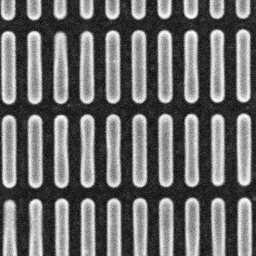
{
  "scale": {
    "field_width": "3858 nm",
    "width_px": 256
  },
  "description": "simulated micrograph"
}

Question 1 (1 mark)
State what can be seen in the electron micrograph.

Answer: groups of lines, slits or small figures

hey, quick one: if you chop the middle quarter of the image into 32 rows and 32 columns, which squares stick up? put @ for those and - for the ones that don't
@---@@@----@@@---@@@----@@@----@
@---@@@----@@@---@@@----@@@----@
@---@@@----@@@---@@@----@@@----@
@---@@@----@@@---@@@----@@@---@@
@---@@@----@@@---@@@----@@@---@@
@---@@@----@@@---@@@----@@@---@@
@---@@@----@@@---@@@----@@@---@@
@---@@@----@@@---@@@----@@@---@@
@---@@@----@@@---@@@----@@@---@@
-----@@----@@-----@@-----@-----@
--------------------------------
--------------------------------
--------------------------------
-----@@----@@@----@@----@@@----@
@---@@@----@@@---@@@----@@@----@
@---@@@----@@@---@@@----@@@----@
----@@@----@@@---@@@----@@@----@
----@@@----@@@---@@@----@@@----@
-----@@----@@@---@@@----@@@----@
-----@@----@@@---@@@----@@@----@
-----@@----@@@---@@@----@@@----@
-----@@----@@@---@@@----@@@----@
-----@@----@@@---@@@----@@@----@
@----@@----@@@---@@@@---@@@----@
@----@@----@@@---@@@----@@@----@
@---@@@----@@@---@@@----@@@----@
@---@@@----@@@---@@@@---@@@----@
@---@@@----@@@---@@@@---@@@----@
@---@@@----@@@---@@@@---@@@----@
@---@@@----@@@---@@@----@@@----@
-----@------@-------------------
--------------------------------